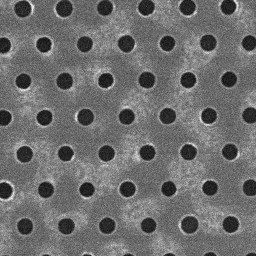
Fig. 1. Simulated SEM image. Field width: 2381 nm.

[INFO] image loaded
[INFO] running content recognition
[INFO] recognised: a regular array of holes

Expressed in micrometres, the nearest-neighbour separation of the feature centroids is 0.381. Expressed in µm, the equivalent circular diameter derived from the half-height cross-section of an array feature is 0.152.